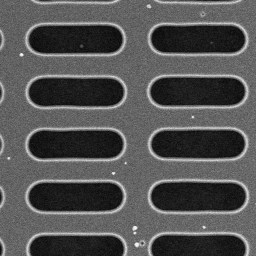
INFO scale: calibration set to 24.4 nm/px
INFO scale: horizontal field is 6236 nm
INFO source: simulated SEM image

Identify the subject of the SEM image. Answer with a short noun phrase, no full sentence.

groups of lines, slits or small figures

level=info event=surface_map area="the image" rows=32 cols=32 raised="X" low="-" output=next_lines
XXXXXXXXXXXXXXXXXXXXXXXXXXXXXXXX
XXXXXXXXXXXXXXXXXXXXXXXXXXXXXXXX
XXXXXXXXXXXXXXXXXXXXXXXXXXXXXXXX
XXXX-----------XXXX-----------XX
XXXX-----------XXXX------------X
XXXX-----------XXXX------------X
XXXXX---------XXXXXX----------XX
XXXXXXXXXXXXXXXXXXXXXXXXXXXXXXXX
XXXXXXXXXXXXXXXXXXXXXXXXXXXXXXXX
XXXXXXXXXXXXXXXXXXXXXXX-XXXXXXXX
XXXX-----------XXXX-----------XX
XXX-------------XXX------------X
XXXX-----------XXXX-----------XX
XXXXXXXXXXXXXXXXXXXXXXXXXXXXXXXX
XXXXXXXXXXXXXXXXXXXXXXXXXXXXXXXX
XXXXXXXXXXXXXXXXXXXXXXXXXXXXXXXX
XXXX-----------XXXXX----------XX
XXXX-----------XXXX------------X
XXXX-----------XXXX------------X
XXXX-----------XXXXX----------XX
XXXXXXXXXXXXXXXXXXXXXXXXXXXXXXXX
XXXXXXXXXXXXXXXXXXXXXXXXXXXXXXXX
XXXXXXXXXXXXXXXXXXXXXXXXXXXXXXXX
XXXX-----------XXXX-----------XX
XXX------------XXXX------------X
XXXX-----------XXXX------------X
XXXXXX------XXXXXXXXXX---XX-XXXX
XXXXXXXXXXXXXXXXXXXXXXXXXXXXXXXX
XXXXXXXXXXXXXXXXXXXXXXXXXXXXXXXX
XXXXX---------XXXXXX----------XX
XXXX-----------XXXX------------X
XXXX------------XXX------------X